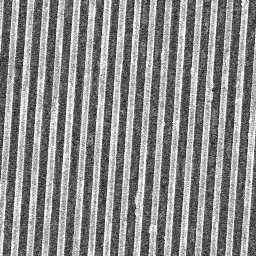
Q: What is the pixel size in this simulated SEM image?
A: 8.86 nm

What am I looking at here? parallel lines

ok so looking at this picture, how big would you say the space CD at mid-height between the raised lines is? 80.7 nm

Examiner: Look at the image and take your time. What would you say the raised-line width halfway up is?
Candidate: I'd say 48.6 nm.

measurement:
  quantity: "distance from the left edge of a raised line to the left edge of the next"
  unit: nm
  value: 135